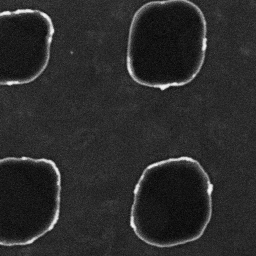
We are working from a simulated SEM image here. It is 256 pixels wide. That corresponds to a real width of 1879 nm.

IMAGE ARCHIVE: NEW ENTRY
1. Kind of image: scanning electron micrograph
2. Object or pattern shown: raised bodies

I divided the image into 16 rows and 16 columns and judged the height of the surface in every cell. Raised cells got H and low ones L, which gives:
LLLLLLLLLHHHLLLL
HHHLLLLLHHHLLLLL
HHLLLLLLHHHHHLLL
HHHLLLLLHHHHHLLL
HHHLLLLLLHHHLLLL
LLLLLLLLLLLLLLLL
LLLLLLLLLLLLLLLL
LLLLLLLLLLLLLLLL
LLLLLLLLLLLLLLLL
LLLLLLLLLLLLLLLL
HHHHLLLLLHHHHLLL
HHHHLLLLLHHHHLLL
HHHLLLLLHHHHHLLL
HHHHLLLLHHHHHLLL
HHHLLLLLHHHHHLLL
LLLLLLLLLLLLLLLL